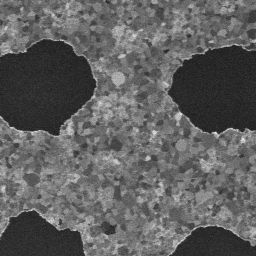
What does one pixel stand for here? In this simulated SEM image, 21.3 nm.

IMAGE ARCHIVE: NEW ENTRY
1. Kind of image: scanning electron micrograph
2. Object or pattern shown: holes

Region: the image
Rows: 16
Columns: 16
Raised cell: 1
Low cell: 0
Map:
1111111111111111
1111111111111111
1110111111111111
0000011111110000
0000001111100000
0000001111100000
0000011111100000
0000111111110000
1111111111111111
1111111111111111
1111111111111111
1111111111111111
1111111111111111
1001111111111111
0000011111110011
0000011111100000